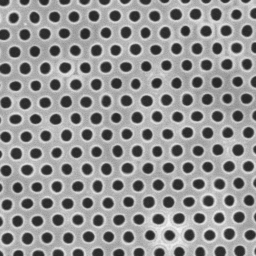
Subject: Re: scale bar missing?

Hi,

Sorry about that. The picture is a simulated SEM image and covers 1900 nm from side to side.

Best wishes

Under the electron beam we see a regular array of holes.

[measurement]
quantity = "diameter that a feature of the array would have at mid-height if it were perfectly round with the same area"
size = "85.4 nm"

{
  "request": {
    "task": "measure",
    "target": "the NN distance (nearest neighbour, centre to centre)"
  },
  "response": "142 nanometers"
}